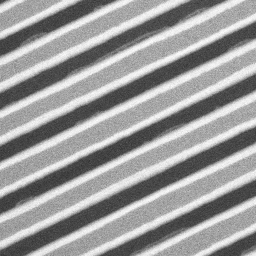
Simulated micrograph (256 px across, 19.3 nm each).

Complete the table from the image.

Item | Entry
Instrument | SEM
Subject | lines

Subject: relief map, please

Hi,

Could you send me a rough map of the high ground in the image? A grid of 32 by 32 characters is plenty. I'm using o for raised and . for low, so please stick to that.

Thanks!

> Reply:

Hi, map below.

ooooooooo.....oooooooo......oooo
ooooooo.....oooooooo......oooooo
ooooo.....oooooooo......oooooooo
ooo.....oooooooo......oooooooo..
o.....oooooooo......oooooooo....
....oooooooo.....ooooooooo.....o
..oooooooo.....ooooooooo.....ooo
oooooooo.....ooooooooo.....ooooo
oooooo.....ooooooooo.....ooooooo
oooo.....oooooooo......oooooooo.
oo.....ooooooooo.....oooooooo...
.....oooooooo.....ooooooooo.....
...oooooooo.....ooooooooo.....oo
.oooooooo.....ooooooooo.....oooo
ooooooo.....ooooooooo.....oooooo
ooooo.....ooooooooo.....oooooooo
ooo.....ooooooooo.....oooooooo..
o.....ooooooooo.....oooooooo....
....ooooooooo....ooooooooo.....o
..ooooooooo....ooooooooo.....ooo
ooooooooo....ooooooooo.....ooooo
oooooo.....ooooooooo.....ooooooo
oooo.....ooooooooo.....oooooooo.
oo.....oooooooo......oooooooo...
.....ooooooooo.....oooooooo.....
...oooooooo.....ooooooooo.....oo
.oooooooo......oooooooo.....oooo
ooooooo......oooooooo.....oooooo
ooooo.....ooooooooo.....oooooooo
ooo......oooooooo.....ooooooooo.
o.....ooooooooo.....ooooooooo...
....ooooooooo.....ooooooooo.....